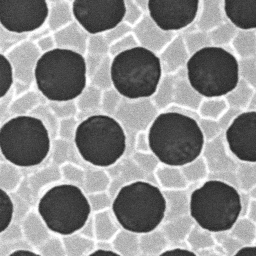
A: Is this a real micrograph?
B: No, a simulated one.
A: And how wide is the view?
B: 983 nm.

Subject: a regular array of holes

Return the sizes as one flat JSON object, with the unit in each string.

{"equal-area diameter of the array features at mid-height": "51.8 pixels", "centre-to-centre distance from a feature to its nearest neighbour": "75.2 pixels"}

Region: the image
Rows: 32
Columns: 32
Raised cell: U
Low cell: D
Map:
DDDDDDUUUDDDDDDDUUDDDDDDDUUUDDDD
DDDDDDUUUDDDDDDDUUUDDDDDDUUUDDDD
DDDDDDUUUUDDDDDUUUUDDDDDUUUUUDDD
UDDDDUUUUUDDDDUUUUUUDDDUUUUUUUDD
UUUUUUUUUUUUUUUUUUUUUUUUUUUUUUUU
UUUUUUUUUUUUUUUUUUUUUUUUUUUUUUUU
UUUUUUDDDUUUUUUDDDDUUUUUDDDDUUUU
DUUUUDDDDDDUUUDDDDDDUUUDDDDDDDUU
DDUUDDDDDDDUUUDDDDDDUUUDDDDDDDUU
DDUUDDDDDDDUUUDDDDDDUUUUDDDDDDUU
DDUUUDDDDDDUUUDDDDDDUUUUDDDDDDUU
DUUUUDDDDDUUUUUDDDDUUUUUUDDDDUUU
UUUUUUDDDUUUUUUUUUUUUUUUUUUUUUUU
UUUUUUUUUUUUUUUUUUUUUUUUUUUUUUUU
UUDDUUUUUUUDDUUUUUUUDDDUUUUUUUDD
UDDDDUUUUUDDDDDUUUUDDDDDDUUUUDDD
DDDDDDUUUDDDDDDDUUUDDDDDDUUUDDDD
DDDDDDUUUDDDDDDDUUDDDDDDDDUUDDDD
DDDDDDUUUUDDDDDDUUUDDDDDDUUUUDDD
DDDDDDUUUUDDDDDUUUUDDDDDDUUUUDDD
UUDDDUUUUUUDDDUUUUUUDDDUUUUUUUUU
UUUUUUUUUUUUUUUUUUUUUUUUUUUUUUUU
UUUUUUUUUUUUUUUUUUUUUUUUUUUUUUUU
UUUUUUDDDDUUUUUDDDDDUUUUUDDDDUUU
DUUUUDDDDDDUUUUDDDDDUUUUDDDDDDUU
DDUUUDDDDDDUUUDDDDDDDUUUDDDDDDUU
DDUUUDDDDDDUUUDDDDDDDUUUDDDDDDUU
DUUUUDDDDDDUUUUDDDDDUUUUDDDDDDUU
DUUUUUDDDDUUUUUUDDDUUUUUUDDDDUUU
UUUUUUUUUUUUUUUUUUUUUUUUUUUUUUUU
UUUUUUUUUUUUUUUUUUUUUUUUUUUUUUUU
UUDDUUUUUUUUDDUUUUUUDDDDUUUUUUDD